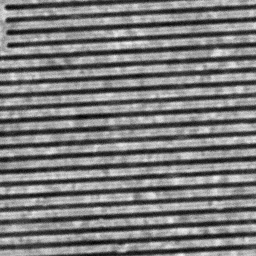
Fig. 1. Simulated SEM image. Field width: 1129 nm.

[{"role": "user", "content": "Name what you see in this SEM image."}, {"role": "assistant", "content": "parallel lines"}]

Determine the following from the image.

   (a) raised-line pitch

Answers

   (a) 12.6 pixels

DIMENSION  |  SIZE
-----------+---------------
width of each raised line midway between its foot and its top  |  26.4 nanometres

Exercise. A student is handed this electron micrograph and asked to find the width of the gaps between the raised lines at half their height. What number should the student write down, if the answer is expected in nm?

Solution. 30.8